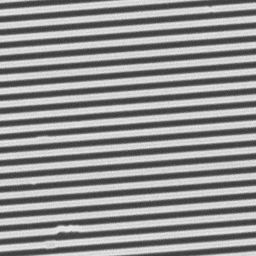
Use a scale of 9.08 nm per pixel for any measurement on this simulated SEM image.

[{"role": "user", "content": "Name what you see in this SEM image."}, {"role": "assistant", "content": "parallel lines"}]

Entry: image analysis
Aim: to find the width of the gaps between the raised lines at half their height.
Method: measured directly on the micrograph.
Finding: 7.35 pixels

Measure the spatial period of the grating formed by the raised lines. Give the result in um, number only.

0.118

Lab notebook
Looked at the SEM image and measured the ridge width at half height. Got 49.8 nanometers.